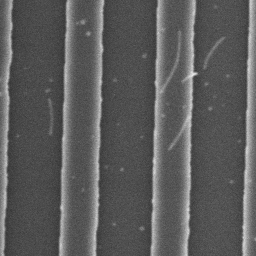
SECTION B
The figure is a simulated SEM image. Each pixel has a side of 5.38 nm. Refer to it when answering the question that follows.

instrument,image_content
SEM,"lines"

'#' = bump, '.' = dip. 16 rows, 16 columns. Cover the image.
#...##....##....
#...##....##....
#...##....##....
#...##....##....
#...##....##....
....##....##....
#...##....##...#
....##....##...#
....##....##...#
....##....##...#
....##....##...#
....##....##...#
....##....##...#
....##....##...#
....##....##...#
....##...###...#